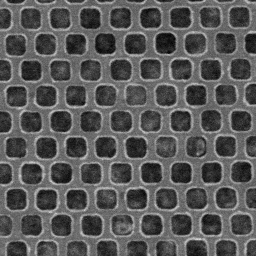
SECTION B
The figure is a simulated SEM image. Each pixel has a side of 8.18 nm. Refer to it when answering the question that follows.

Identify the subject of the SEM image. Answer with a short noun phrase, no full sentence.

a regular array of holes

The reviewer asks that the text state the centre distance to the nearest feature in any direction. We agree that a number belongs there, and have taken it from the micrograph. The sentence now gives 241 nm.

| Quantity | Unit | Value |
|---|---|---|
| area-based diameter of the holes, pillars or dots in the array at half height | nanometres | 186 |